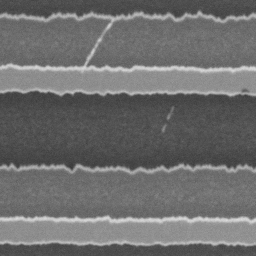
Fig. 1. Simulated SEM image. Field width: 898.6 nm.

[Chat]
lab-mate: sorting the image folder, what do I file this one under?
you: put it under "lines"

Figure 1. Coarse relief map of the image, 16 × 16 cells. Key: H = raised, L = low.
LLLLLLLLLLLLLLLL
HHHHHHHHHHHHHHHH
HHHHHHHHHHHHHHHH
HHHHHHHHHHHHHHHH
HHHHHHHHHHHHHHHH
HHHHHHHHHHHHHHHH
LLLLLLLLLLLLLLLL
LLLLLLLLLLLLLLLL
LLLLLLLLLLLLLLLL
LLLLLLLLLLLLLLLL
HLHHLLLLLLLHLLLL
HHHHHHHHHHHHHHHH
HHHHHHHHHHHHHHHH
HHHHHHHHHHHHHHHH
HHHHHHHHHHHHHHHH
LLLLLLLLLLLLLLLL